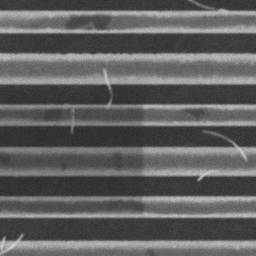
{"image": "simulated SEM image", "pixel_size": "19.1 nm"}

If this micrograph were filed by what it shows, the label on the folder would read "lines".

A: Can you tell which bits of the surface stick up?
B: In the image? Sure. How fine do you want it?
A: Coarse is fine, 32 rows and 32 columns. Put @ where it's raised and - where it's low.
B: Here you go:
--------------------------------
----------------------------@---
@@@@@@@@@@@@@@@@@@@@@@@@@@@@@@@@
@@@@@@@@@@@@@@@@@@@@@@@@@@@@@@@@
--------------------------------
--------------------------------
--------------------------------
@@@@@@@@@@@@@@@@@@@@@@@@@@@@@@@@
@@@@@@@@@@@@@@@@@@@@@@@@@@@@@@@@
@@@@@@@@@@@@@@@@@@@@@@@@@@@@@@@@
--------------------------------
--------------------------------
--------------------------------
@@@@@@@@@@@@@@@@@@@@@@@@@@@@@@@@
@@@@@@@@@@@@@@@@@@@@@@@@@@@@@@@@
@@@@@@@@@@@@@@@@@@@@@@@@@@@@@@@@
--------------------------------
--------------------------------
--------------------------------
@@@@@@@@@@@@@@@@@@@@@@@@@@@@@@@@
@@@@@@@@@@@@@@@@@@@@@@@@@@@@@@@@
@@@@@@@@@@@@@@@@@@@@@@@@@@@@@@@@
--------------------------------
--------------------------------
--------------------------------
@@@@@@@@@@@@@@@@@@@@@@@@@@@@@@@@
@@@@@@@@@@@@@@@@@@@@@@@@@@@@@@@@
--------------------------------
--------------------------------
--------------------------------
@@@@@@@@@@@@@@@@@@@@@@@@@@@@@@@@
@@@@@@@@@@@@@@@@@@@@@@@@@@@@@@@@